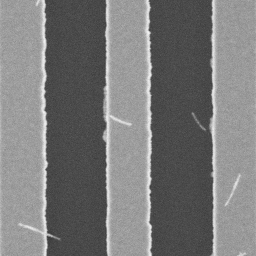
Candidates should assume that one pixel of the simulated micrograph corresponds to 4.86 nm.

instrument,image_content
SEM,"lines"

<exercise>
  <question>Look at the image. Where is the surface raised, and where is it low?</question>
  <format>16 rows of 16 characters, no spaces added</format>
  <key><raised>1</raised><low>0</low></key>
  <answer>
1110000110000111
1110000110000111
1110000110000111
1110000110000111
1110000110000111
1110000110000111
1110000110000111
1110000110000111
1110000110000111
1110000110000111
1110000110000111
1110000110000111
1110000110000111
1110000110000111
1110000110000111
1110000110000111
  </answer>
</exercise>